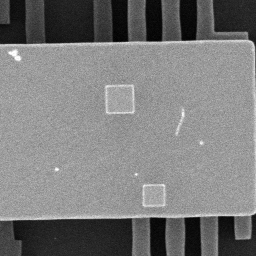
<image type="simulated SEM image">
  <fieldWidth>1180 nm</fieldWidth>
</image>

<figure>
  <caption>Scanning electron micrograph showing wiring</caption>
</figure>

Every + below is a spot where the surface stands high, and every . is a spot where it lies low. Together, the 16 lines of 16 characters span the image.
................
................
................
++++++++++++++++
++++++++++++++++
++++++++++++++++
++++++++++++++++
++++++++++++++++
++++++++++++++++
++++++++++++++++
++++++++++++++++
++++++++++++++++
++++++++++++++++
+++++++++++++...
................
................